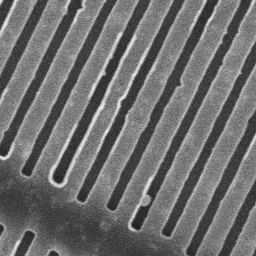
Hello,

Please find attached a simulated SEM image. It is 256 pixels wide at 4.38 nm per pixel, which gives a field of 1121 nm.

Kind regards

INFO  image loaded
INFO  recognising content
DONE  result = parallel lines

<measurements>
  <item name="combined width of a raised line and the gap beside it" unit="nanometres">134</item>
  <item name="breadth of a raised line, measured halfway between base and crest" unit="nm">86.5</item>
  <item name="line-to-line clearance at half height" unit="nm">47.7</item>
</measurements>